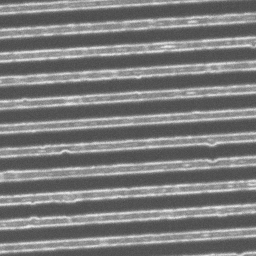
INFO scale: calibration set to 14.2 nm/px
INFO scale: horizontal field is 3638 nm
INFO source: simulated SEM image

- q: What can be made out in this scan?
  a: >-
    parallel lines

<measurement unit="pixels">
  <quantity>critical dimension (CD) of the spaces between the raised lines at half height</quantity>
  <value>5.99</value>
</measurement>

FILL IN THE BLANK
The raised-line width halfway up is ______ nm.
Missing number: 243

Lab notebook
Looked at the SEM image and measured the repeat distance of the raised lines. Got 0.339 um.